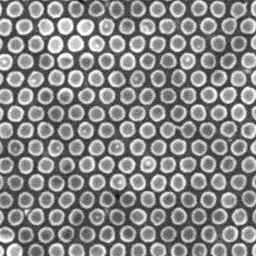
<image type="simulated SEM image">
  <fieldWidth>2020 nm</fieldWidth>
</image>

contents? a regular array of raised bodies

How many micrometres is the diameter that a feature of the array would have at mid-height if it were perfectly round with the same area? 0.117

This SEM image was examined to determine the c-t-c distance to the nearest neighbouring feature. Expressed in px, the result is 19.4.